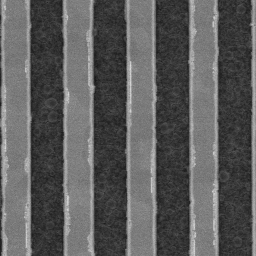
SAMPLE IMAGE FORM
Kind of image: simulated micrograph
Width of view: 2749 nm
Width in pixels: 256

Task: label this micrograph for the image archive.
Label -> one or a few lines or trenches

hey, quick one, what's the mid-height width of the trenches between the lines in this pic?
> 400 nm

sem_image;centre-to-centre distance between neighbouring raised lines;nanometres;673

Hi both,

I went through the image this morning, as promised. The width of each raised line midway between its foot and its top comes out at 277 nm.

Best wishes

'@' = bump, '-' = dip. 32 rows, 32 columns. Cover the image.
@@@@----@@@-----@@@-----@@@-----
@@@@----@@@-----@@@-----@@@-----
@@@@----@@@-----@@@-----@@@-----
@@@@----@@@-----@@@-----@@@-----
@@@-----@@@-----@@@-----@@@-----
@@@@----@@@-----@@@-----@@@-----
@@@@----@@@-----@@@-----@@@-----
@@@@----@@@-----@@@-----@@@-----
@@@@----@@@-----@@@-----@@@-----
@@@@----@@@-----@@@-----@@@-----
@@@@----@@@@----@@@-----@@@-----
@@@@----@@@-----@@@-----@@@-----
@@@@----@@@-----@@@-----@@@-----
@@@@----@@@-----@@@-----@@@-----
@@@@----@@@-----@@@-----@@@-----
@@@@----@@@-----@@@-----@@@-----
@@@@----@@@-----@@@-----@@@-----
@@@@----@@@-----@@@-----@@@-----
@@@@----@@@-----@@@-----@@@-----
@@@@----@@@-----@@@-----@@@-----
@@@@----@@@-----@@@-----@@@-----
@@@@----@@@-----@@@-----@@@-----
@@@@----@@@-----@@@-----@@@-----
@@@@----@@@-----@@@-----@@@-----
@@@@----@@@-----@@@-----@@@-----
-@@@----@@@-----@@@-----@@@-----
-@@@----@@@-----@@@-----@@@-----
@@@@----@@@-----@@@-----@@@-----
-@@@----@@@-----@@@-----@@@-----
-@@@----@@@-----@@@-----@@@-----
-@@@----@@@@----@@@-----@@@-----
-@@@----@@@@----@@@-----@@@-----